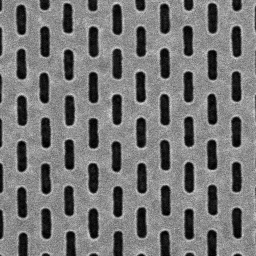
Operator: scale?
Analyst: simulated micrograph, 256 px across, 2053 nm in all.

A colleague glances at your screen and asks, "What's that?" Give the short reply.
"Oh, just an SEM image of a regular array of holes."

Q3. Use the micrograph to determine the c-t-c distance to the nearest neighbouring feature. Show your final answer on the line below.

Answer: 0.259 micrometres